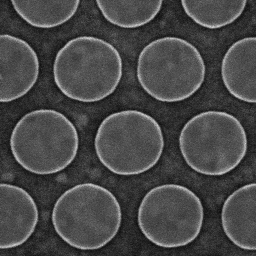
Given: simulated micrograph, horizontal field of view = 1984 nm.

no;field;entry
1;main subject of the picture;raised bodies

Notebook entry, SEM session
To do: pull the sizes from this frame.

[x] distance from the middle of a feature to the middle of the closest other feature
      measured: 0.648 micrometres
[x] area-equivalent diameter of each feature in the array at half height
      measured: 0.504 um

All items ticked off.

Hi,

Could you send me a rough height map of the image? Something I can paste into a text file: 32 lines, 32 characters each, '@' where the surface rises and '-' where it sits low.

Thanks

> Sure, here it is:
--@@@@@@@@--@@@@@@@@---@@@@@@@@-
--@@@@@@@----@@@@@@@---@@@@@@@--
---@@@@@------@@@@@-----@@@@@---
--------------------------------
@-------------------------------
@@@-----@@@@@@-----@@@@@-----@@@
@@@@----@@@@@@@---@@@@@@@---@@@@
@@@@@--@@@@@@@@--@@@@@@@@---@@@@
@@@@@--@@@@@@@@--@@@@@@@@---@@@@
@@@@@--@@@@@@@@--@@@@@@@@---@@@@
@@@@---@@@@@@@@---@@@@@@@---@@@@
@@@-----@@@@@@-----@@@@@-----@@@
@@--------@@--------@@---------@
--------------------------------
---@@@@@------@@@@-------@@@@---
--@@@@@@@----@@@@@@@---@@@@@@@--
--@@@@@@@---@@@@@@@@---@@@@@@@--
-@@@@@@@@@--@@@@@@@@--@@@@@@@@@-
-@@@@@@@@@--@@@@@@@@---@@@@@@@@-
--@@@@@@@---@@@@@@@@---@@@@@@@--
---@@@@@-----@@@@@@-----@@@@@@--
----@@@-------@@@@-------@@@----
--------------------------------
@@-------@@@@------@@@@-------@@
@@@@----@@@@@@----@@@@@@-----@@@
@@@@---@@@@@@@@---@@@@@@@---@@@@
@@@@@--@@@@@@@@--@@@@@@@@---@@@@
@@@@@--@@@@@@@@--@@@@@@@@---@@@@
@@@@---@@@@@@@@---@@@@@@@---@@@@
@@@@----@@@@@@----@@@@@@@----@@@
@@-------@@@@-------@@@-------@@
--------------------------------